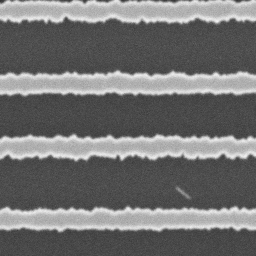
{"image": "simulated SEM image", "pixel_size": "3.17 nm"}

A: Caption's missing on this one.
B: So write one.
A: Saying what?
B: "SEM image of lines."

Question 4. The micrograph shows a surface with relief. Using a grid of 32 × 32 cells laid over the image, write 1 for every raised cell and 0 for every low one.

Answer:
11111111111111111111111111111111
11111111111111111111111111111111
11111111011110011111111101111011
00000000000000000000000000000000
00000000000000000000000000000000
00000000000000000000000000000000
00000000000000000000000000000000
00000000000000000000000000000000
00000000000000000000000000000000
11111111111111111111111111111111
11111111111111111111111111111111
11111111111111111111111111111111
00000000000000000000000000000000
00000000000000000000000000000000
00000000000000000000000000000000
00000000000000000000000000000000
00000000000000000000000000000000
11111111111111111111111111111111
11111111111111111111111111111111
11111101111001110111110111101110
00000000000000000000000000000000
00000000000000000000000000000000
00000000000000000000000000000000
00000000000000000000000000000000
00000000000000000000000000000000
00000000000000000000000000000000
11111111111111111111111111111111
11111111111111111111111111111111
11111111111111111111111111100111
00000000000000000000000000000000
00000000000000000000000000000000
00000000000000000000000000000000